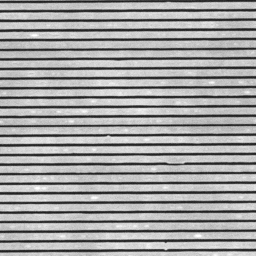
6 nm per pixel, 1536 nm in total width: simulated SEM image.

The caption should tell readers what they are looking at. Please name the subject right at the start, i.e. parallel lines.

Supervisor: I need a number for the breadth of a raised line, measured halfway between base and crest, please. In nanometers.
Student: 41.2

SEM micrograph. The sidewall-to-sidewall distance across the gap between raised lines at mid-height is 17.2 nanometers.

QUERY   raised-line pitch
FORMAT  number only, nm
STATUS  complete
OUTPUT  57.5